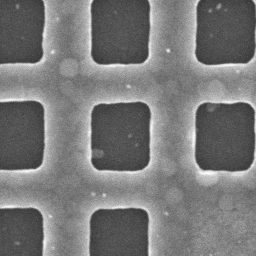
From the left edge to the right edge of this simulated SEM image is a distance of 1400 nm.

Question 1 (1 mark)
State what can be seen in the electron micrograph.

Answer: holes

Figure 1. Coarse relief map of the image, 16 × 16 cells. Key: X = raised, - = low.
---XXX---XXX----
---XXX---XXX----
---XXX---XXX----
---XXX---XXX----
XXXXXXXXXXXXXXXX
XXXXXXXXXXXXXXXX
--XXXX---XXXX--X
---XXX---XXX----
---XXX---XXX----
---XXX---XXX----
--XXXX---XXXX--X
XXXXXXXXXXXXXXXX
XXXXXXXXXXXXXXXX
---XXX---XXXXXXX
---XXX---XXXXXXX
---XXX---XXXXXXX